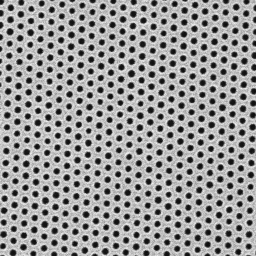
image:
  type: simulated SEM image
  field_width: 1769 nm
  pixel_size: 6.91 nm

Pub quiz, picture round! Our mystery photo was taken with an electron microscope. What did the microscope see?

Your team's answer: a regular array of holes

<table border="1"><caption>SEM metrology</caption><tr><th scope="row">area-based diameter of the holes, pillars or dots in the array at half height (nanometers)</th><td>45.5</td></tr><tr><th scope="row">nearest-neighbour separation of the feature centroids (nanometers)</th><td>80.2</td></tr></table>